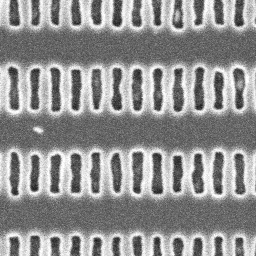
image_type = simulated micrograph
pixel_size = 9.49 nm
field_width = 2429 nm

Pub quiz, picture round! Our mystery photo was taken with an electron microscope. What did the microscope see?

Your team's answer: a regular array of holes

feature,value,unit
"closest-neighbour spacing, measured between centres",192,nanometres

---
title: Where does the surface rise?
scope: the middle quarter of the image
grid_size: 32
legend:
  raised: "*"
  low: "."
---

********************************
**..***...**...**..***...**...**
*...***...**...**...**...**...**
**..***...**...**...**..***...**
**..***...**..***...**..***...**
**...**...**..***...**..***...**
*...***...**..***...**..***...**
*...***...**..***...**...**...**
*...***...**...**...**...**...**
*...***..***...**...**...**...**
*...***..***...**...**..***...**
**..****.***..****.****.***..***
********************************
********************************
********************************
********************************
********************************
********************************
********************************
********************************
********************************
********************************
**..***..***..***...**..********
*...***..***..***...**...**...**
*...***..**...***...**..***...**
*....**..***...**...**..***...**
**..***..***...**...**..***...**
**..**...***...**...**...**...**
**...**..***...**...**...**...**
**..***..***...**...**...**..***
**..***..***..***...**...**..***
*...***..***..***...**...**..***